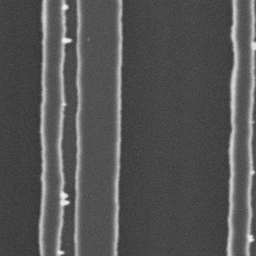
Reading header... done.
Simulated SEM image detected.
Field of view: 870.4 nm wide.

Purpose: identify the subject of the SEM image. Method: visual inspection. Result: lines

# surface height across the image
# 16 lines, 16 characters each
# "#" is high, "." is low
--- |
...#####.......#
...#####.......#
...#####.......#
...#####.......#
...#####.......#
...#####.......#
...#####.......#
...####........#
...####.......##
...####.......##
...####.......##
...####.......##
...####.......##
...####.......##
...####.......##
...####.......##